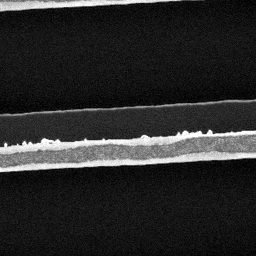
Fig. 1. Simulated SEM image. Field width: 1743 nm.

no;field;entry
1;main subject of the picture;lines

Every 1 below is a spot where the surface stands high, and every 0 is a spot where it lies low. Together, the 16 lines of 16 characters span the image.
1110000000000000
0000000000000000
0000000000000000
0000000000000000
0000000000000000
0000000000000000
0000000000011111
1111111111111111
1111111111111111
1111111111111111
1111000000000000
0000000000000000
0000000000000000
0000000000000000
0000000000000000
0000000000000000